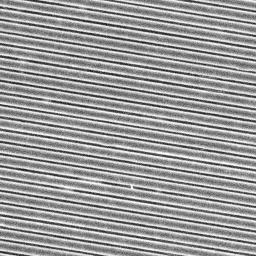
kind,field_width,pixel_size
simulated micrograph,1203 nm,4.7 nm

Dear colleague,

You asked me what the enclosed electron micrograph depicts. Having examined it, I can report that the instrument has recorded parallel lines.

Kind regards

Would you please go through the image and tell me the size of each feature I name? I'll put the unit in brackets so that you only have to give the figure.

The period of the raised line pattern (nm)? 56.6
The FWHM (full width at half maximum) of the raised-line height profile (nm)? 42.3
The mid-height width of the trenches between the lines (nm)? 15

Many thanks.